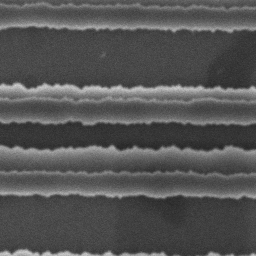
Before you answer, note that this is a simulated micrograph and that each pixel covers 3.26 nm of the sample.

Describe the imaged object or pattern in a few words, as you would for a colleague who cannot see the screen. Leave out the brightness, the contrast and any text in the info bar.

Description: lines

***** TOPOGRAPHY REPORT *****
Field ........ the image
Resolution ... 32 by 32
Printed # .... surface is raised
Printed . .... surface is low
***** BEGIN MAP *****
################################
################################
################################
.........##.#.###..#############
................................
................................
................................
................................
................................
................................
................................
################################
################################
################################
################################
..............................#.
................................
................................
#.#.....#.####......##......##..
################################
################################
################################
################################
################################
..............##...##....#.###.#
................................
................................
................................
................................
................................
................................
..##............................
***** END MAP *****